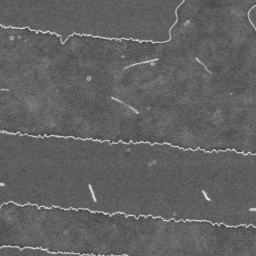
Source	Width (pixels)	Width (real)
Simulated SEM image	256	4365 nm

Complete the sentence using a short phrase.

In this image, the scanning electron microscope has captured one or a few lines or trenches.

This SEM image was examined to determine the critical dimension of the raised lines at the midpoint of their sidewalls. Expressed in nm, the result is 1220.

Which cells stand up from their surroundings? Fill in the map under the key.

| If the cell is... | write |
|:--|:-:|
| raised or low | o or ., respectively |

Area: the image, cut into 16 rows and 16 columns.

ooooooooooo.....
ooooooooooo.....
........oo......
................
................
................
................
................
oo.o............
ooooooooooooooo.
oooooooooooooooo
oooooooooooooooo
oooooooooooooooo
........oooooooo
................
oo..............